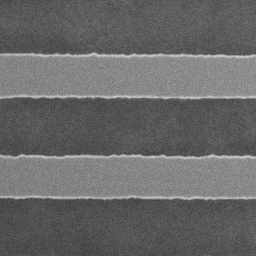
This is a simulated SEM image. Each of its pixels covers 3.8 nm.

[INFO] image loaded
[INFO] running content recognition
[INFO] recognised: lines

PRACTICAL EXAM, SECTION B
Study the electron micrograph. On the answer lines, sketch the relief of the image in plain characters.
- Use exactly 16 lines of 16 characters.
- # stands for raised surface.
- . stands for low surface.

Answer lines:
................
................
................
################
################
################
................
................
................
................
################
################
................
................
................
................